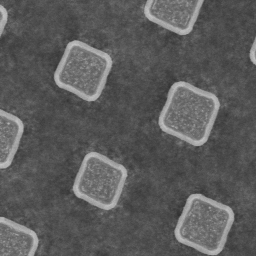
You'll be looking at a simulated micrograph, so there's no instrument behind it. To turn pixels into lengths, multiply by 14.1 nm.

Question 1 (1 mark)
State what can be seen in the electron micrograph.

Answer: raised bodies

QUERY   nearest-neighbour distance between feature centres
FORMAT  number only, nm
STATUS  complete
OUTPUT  1580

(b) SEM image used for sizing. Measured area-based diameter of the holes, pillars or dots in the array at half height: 730 nm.